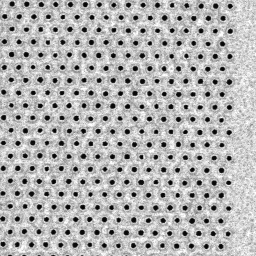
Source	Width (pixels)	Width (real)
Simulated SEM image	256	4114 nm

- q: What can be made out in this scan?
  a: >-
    a regular array of holes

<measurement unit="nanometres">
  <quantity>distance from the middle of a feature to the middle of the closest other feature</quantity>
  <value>228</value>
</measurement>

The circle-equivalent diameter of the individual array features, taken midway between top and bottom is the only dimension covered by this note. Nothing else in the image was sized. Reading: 5.53 pixels